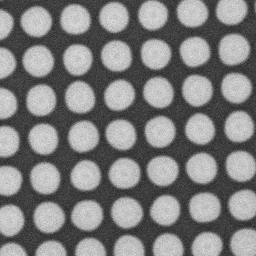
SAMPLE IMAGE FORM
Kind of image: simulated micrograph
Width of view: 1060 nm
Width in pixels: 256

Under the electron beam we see an array of small figures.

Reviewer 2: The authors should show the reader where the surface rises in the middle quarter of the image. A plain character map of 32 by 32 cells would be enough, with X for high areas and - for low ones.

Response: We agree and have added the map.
XXXXXXX---XXXXXX-----XXXX------X
-XXXXX------XXX-----------------
--XXX---------------------------
----------------------XXX------X
---XX-------XXXX-----XXXXX----XX
-XXXXX-----XXXXXX---XXXXXXX---XX
-XXXXXX----XXXXXX---XXXXXXX---XX
XXXXXXX---XXXXXXXX--XXXXXXX---XX
XXXXXXXX--XXXXXXXX--XXXXXXX---XX
XXXXXXXX--XXXXXXX----XXXXXX----X
-XXXXXX----XXXXX------XXXX------
--XXXXX------X------------------
--------------------------------
-----------------------XXX------
----XX------XXXX-----XXXXXX----X
--XXXXXX---XXXXXX---XXXXXXXX--XX
--XXXXXX---XXXXXXX--XXXXXXXX--XX
-XXXXXXXX--XXXXXXX--XXXXXXXX--XX
-XXXXXXXX--XXXXXXX---XXXXXX----X
-XXXXXXXX--XXXXXXX---XXXXXX-----
--XXXXXX----XXXXX-----XXX-------
---XXX--------------------------
--------------------------------
-----------------------XXXX-----
----XXX------XXXXX---XXXXXXX---X
---XXXXX----XXXXXXX--XXXXXXX---X
--XXXXXXX--XXXXXXXX--XXXXXXXX--X
--XXXXXXX--XXXXXXXX--XXXXXXX---X
--XXXXXXX--XXXXXXXX--XXXXXXX----
--XXXXXXX---XXXXXX----XXXXX-----
---XXXXX-----XXXX---------------
----XX--------------------------